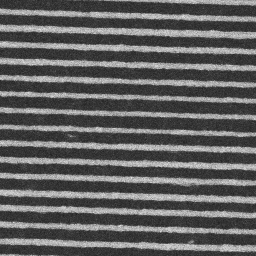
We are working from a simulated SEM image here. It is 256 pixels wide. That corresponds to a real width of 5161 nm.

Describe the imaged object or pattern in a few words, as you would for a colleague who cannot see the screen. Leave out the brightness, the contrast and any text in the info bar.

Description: parallel lines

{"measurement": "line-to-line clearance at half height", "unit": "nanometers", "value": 78.1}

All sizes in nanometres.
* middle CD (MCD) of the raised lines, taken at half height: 252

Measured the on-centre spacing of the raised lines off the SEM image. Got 16.4 px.